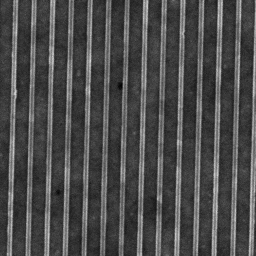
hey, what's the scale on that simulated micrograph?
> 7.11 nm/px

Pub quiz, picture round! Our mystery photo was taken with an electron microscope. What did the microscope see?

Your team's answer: parallel lines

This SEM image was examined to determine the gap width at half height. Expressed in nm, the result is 105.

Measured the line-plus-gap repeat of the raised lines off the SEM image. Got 132 nm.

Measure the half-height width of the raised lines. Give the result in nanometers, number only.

24.9